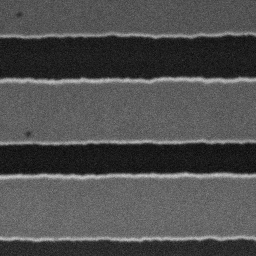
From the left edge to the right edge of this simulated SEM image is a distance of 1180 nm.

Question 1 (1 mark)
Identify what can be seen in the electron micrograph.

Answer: lines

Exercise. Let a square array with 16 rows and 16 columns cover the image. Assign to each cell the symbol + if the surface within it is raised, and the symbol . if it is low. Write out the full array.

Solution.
++++++++++++++++
++++++++++++++++
................
................
................
++++++++++++++++
++++++++++++++++
++++++++++++++++
++++++++++++++++
................
................
++++++++++++++++
++++++++++++++++
++++++++++++++++
++++++++++++++++
................